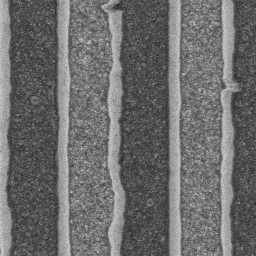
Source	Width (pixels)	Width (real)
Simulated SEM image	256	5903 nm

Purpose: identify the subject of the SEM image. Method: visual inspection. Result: one or a few lines or trenches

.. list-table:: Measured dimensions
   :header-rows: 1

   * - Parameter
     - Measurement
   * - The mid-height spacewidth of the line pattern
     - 60.3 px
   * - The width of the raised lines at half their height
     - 1190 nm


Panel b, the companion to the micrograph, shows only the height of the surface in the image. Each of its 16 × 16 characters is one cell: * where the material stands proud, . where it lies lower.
....***....***..
....***....***..
....***....***..
....***....***..
....***....***..
....***....***..
....***....***..
....***....***..
....***....***..
....***....***..
....***....***..
....***....***..
....***....***..
....***....***..
....***....***..
....***....***..